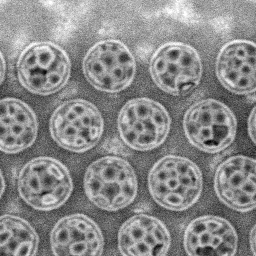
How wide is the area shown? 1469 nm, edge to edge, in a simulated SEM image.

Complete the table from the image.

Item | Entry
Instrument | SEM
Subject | a regular array of raised bodies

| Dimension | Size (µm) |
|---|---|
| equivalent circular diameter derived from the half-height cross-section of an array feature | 0.296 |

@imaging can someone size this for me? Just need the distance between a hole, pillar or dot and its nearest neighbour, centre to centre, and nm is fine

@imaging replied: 376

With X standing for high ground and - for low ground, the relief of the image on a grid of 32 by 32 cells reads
--------------------------------
--------------------------------
--------------------------------
--------------------------------
--------------------------------
----XX------XXX--------------XXX
---XXXXX---XXXXX----XXXX----XXXX
--XXXXXXX--XXXXXX--XXXXXX--XXXXX
X-XXXXXXX-XXXXXXX--XXXXXX--XXXXX
--XXXXXXX--XXXXXX--XXXXXX--XXXXX
---XXXXX---XXXXX----XXXXX---XXXX
----XXX--------------XXX-----XX-
-X---------------X--------X-----
XXXX---XXXXX---XXXXX----XXXX----
XXXX---XXXXXX--XXXXXX--XXXXXX--X
XXXXX-XXXXXXX--XXXXXX--XXXXXX--X
XXXXX-XXXXXXX--XXXXXX--XXXXXX--X
XXXX---XXXXX----XXXX----XXXXX---
XXX-----XXX------XX------XXX----
--------------------------------
---XXXX----XXXXX----XXXX----XXXX
---XXXXX---XXXXXX--XXXXXX--XXXXX
--XXXXXXX--XXXXXX--XXXXXX--XXXXX
--XXXXXXX--XXXXXX--XXXXXX--XXXXX
---XXXXXX--XXXXXX--XXXXXX--XXXXX
----XXXX----XXXX----XXXX----XXXX
--------------------------------
XXX-----XXX-----XXXX----XXXX----
XXXX---XXXXX---XXXXXX--XXXXXX---
XXXXX-XXXXXXX--XXXXXX--XXXXXXX-X
XXXXX--XXXXXX--XXXXXX--XXXXXXX-X
XXXX---XXXXXX--XXXXXX--XXXXXX---